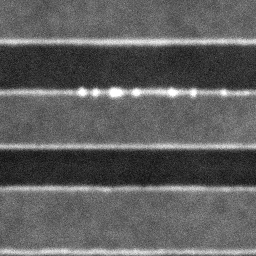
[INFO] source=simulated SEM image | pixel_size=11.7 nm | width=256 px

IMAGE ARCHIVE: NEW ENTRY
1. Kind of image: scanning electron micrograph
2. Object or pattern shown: lines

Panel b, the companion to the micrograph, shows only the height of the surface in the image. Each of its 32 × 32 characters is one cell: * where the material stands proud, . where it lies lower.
********************************
********************************
********************************
********************************
********************************
................................
................................
................................
................................
................................
................................
..........**..*..*...*..*.......
********************************
********************************
********************************
********************************
********************************
********************************
................................
................................
................................
................................
................................
................................
********************************
********************************
********************************
********************************
********************************
********************************
********************************
................................